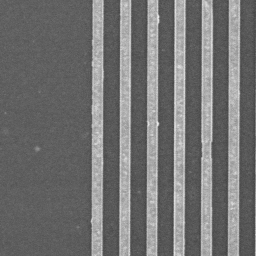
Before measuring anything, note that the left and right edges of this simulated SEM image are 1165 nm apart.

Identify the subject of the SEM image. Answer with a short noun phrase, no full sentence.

parallel lines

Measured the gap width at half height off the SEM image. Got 0.0786 microns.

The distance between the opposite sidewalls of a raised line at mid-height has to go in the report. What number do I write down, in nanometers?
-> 45.5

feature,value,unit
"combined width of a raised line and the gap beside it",0.124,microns